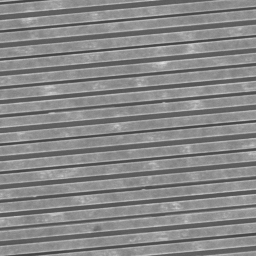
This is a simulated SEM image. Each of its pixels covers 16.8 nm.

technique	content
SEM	parallel lines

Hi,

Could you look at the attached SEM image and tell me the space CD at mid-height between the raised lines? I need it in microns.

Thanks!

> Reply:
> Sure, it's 0.0605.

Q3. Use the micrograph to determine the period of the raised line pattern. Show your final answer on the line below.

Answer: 236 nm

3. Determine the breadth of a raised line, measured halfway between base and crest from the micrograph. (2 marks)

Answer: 167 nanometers